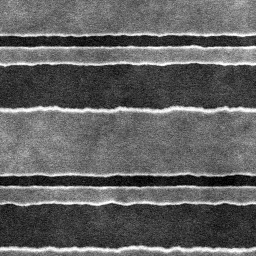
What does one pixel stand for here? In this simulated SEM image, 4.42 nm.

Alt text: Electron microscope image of lines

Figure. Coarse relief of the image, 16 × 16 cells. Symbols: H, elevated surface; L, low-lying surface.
HHHHHHHHHHHHHHHH
HHHHHHHHHHHHHHHH
HHHHHHHHHHHHHHHH
HHHHHHHHHHHHHHHH
LLLLLLLLLLLLLLLL
LLLLLLLLLLLLLLLL
LLLLLLLLLLLLLLLL
HHHHHHHHHHHHHHHH
HHHHHHHHHHHHHHHH
HHHHHHHHHHHHHHHH
HHHHHHHHHHHHHHHH
HHHHHHHHHHHHHHHH
HHHHHHHHHHHHHHHH
LLLLLLLLLLLLLLLL
LLLLLLLLLLLLLLLL
LLLLLLLLHLLLLLLL